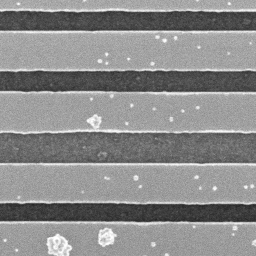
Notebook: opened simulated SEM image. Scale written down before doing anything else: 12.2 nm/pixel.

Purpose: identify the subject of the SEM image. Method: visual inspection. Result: lines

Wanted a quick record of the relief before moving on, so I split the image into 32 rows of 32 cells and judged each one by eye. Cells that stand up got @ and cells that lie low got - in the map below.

@@@@@@@@@@@@@@@@@@@@@@@@@@@@@@@@
--------------------------------
--------------------------------
--------------------------------
@@@@@@@@@@@@@@@@@@@@@@@@@@@@@@@@
@@@@@@@@@@@@@@@@@@@@@@@@@@@@@@@@
@@@@@@@@@@@@@@@@@@@@@@@@@@@@@@@@
@@@@@@@@@@@@@@@@@@@@@@@@@@@@@@@@
@@@@@@@@@@@@@@@@@@@@@@@@@@@@@@@@
--------------------------------
--------------------------------
@@@@@@@@@@@@@@@-----@-----------
@@@@@@@@@@@@@@@@@@@@@@@@@@@@@@@@
@@@@@@@@@@@@@@@@@@@@@@@@@@@@@@@@
@@@@@@@@@@@@@@@@@@@@@@@@@@@@@@@@
@@@@@@@@@@@@@@@@@@@@@@@@@@@@@@@@
@@@@@@@@------@-@----@@@------@@
--------------------------------
--------------------------------
--------------------------------
@@@@@@@@@@@@@@@@@@@@@@@@@@@@@@@@
@@@@@@@@@@@@@@@@@@@@@@@@@@@@@@@@
@@@@@@@@@@@@@@@@@@@@@@@@@@@@@@@@
@@@@@@@@@@@@@@@@@@@@@@@@@@@@@@@@
@@@@@@@@@@@@@@@@@@@@@@@@@@@@@@@@
-----------------@@----@@@@---@@
--------------------------------
--------------------------------
@@@@@@@@@@@@@@@@@@@@@@@@@@@@@@@@
@@@@@@@@@@@@@@@@@@@@@@@@@@@@@@@@
@@@@@@@@@@@@@@@@@@@@@@@@@@@@@@@@
@@@@@@@@@@@@@@@@@@@@@@@@@@@@@@@@